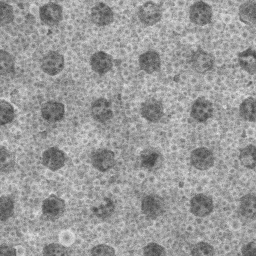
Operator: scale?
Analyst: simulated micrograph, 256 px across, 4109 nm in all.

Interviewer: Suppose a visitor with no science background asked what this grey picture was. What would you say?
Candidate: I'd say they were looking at a regular array of raised bodies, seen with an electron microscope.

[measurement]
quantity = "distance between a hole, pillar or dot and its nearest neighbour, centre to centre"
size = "515 nm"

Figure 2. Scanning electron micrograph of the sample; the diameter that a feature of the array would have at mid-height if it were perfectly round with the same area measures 289 nanometers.